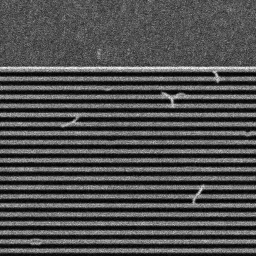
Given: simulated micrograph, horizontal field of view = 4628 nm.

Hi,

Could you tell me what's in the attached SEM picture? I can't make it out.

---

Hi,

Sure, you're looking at parallel lines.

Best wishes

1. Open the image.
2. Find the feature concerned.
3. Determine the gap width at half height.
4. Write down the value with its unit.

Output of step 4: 4.62 px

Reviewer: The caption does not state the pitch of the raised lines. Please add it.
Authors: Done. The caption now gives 163 nm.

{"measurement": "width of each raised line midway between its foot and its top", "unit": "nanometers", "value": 83.6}